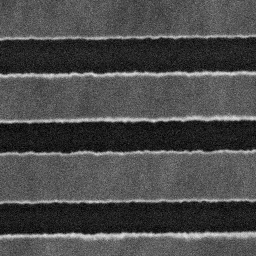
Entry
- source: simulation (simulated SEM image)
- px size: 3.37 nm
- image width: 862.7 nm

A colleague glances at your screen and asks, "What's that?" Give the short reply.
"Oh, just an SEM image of lines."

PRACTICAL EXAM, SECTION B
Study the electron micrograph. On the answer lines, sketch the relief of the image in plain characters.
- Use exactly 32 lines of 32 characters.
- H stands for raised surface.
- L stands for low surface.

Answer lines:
HHHHHHHHHHHHHHHHHHHHHHHHHHHHHHHH
HHHHHHHHHHHHHHHHHHHHHHHHHHHHHHHH
HHHHHHHHHHHHHHHHHHHHHHHHHHHHHHHH
HHHHHHHHHHHHHHHHHHHHHHHHHHHHHHHH
HHHHHHHHHHHHHHHHHHHHHHHHHHHHHHHH
LLLLLLLLLLLLLLLLLLLLLLLLLLLLLLLL
LLLLLLLLLLLLLLLLLLLLLLLLLLLLLLLL
LLLLLLLLLLLLLLLLLLLLLLLLLLLLLLLL
LLLLLLLLLLLLLLLLLLLLLLLLLLLLLLLL
HHHHHHHHHHHHHHHHHHHHHHHHHHHHHHHH
HHHHHHHHHHHHHHHHHHHHHHHHHHHHHHHH
HHHHHHHHHHHHHHHHHHHHHHHHHHHHHHHH
HHHHHHHHHHHHHHHHHHHHHHHHHHHHHHHH
HHHHHHHHHHHHHHHHHHHHHHHHHHHHHHHH
HHHHHHHHHHHHHHHHHHHHHHHHHHHHHHHH
LLLLLLLLLLLLLLLLLLLLLLLLLLLLLLLL
LLLLLLLLLLLLLLLLLLLLLLLLLLLLLLLL
LLLLLLLLLLLLLLLLLLLLLLLLLLLLLLLL
LLLLLLLLLLLLLLLLLLLLLLLLLLLLLLLL
HHHHHHHHHHHHHHHHHHHHHHHHHHHHHHHH
HHHHHHHHHHHHHHHHHHHHHHHHHHHHHHHH
HHHHHHHHHHHHHHHHHHHHHHHHHHHHHHHH
HHHHHHHHHHHHHHHHHHHHHHHHHHHHHHHH
HHHHHHHHHHHHHHHHHHHHHHHHHHHHHHHH
HHHHHHHHHHHHHHHHHHHHHHHHHHHHHHHH
LLLLLLLLLLLLLLLLLLLLLLLLLLLLLLLL
LLLLLLLLLLLLLLLLLLLLLLLLLLLLLLLL
LLLLLLLLLLLLLLLLLLLLLLLLLLLLLLLL
LLLLLLLLLLLLLLLLLLLLLLLLLLLLLLLL
HHHHHHHHHHHHHHHHHHHHHHHHHHHHHHHH
HHHHHHHHHHHHHHHHHHHHHHHHHHHHHHHH
HHHHHHHHHHHHHHHHHHHHHHHHHHHHHHHH